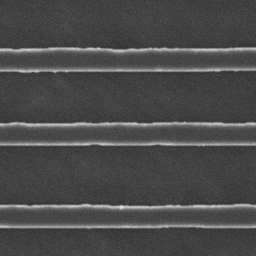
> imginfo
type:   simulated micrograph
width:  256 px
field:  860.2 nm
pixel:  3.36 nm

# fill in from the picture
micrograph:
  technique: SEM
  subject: lines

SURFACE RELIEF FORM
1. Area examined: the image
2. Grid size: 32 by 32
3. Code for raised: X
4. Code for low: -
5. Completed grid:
--------------------------------
--------------------------------
--------------------------------
--------------------------------
--------------------------------
--------------------------------
XXXXXXXXXXXXXXXXXXXXXXXXXXXXXXXX
XXXXXXXXXXXXXXXXXXXXXXXXXXXXXXXX
XXXXXXXXXXXXXXXXXXXXXXXXXXXXXXXX
--------------------------------
--------------------------------
--------------------------------
--------------------------------
--------------------------------
--------------------------------
-XX------XX--XXXXX-XXXXXXXXX---X
XXXXXXXXXXXXXXXXXXXXXXXXXXXXXXXX
XXXXXXXXXXXXXXXXXXXXXXXXXXXXXXXX
--------------------------------
--------------------------------
--------------------------------
--------------------------------
--------------------------------
--------------------------------
--------------------------------
--------------------------------
XXXXXXXXXXXXXXXXXXXXXXXXXXXXXXXX
XXXXXXXXXXXXXXXXXXXXXXXXXXXXXXXX
-----------X--------------------
--------------------------------
--------------------------------
--------------------------------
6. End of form